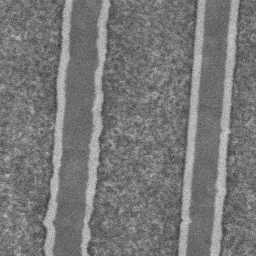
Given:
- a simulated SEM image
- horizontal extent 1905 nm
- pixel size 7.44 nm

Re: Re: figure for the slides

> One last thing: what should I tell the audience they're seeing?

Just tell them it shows one or a few lines or trenches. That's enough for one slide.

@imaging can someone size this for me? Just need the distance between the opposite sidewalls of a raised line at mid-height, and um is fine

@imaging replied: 0.26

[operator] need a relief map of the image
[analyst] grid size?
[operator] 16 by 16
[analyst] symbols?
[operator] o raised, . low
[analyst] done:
....ooo......oo.
....oo.......oo.
....oo......oo..
....oo......oo..
....oo......oo..
....oo......oo..
....oo......oo..
....oo......oo..
....oo......oo..
....oo......oo..
....oo......oo..
...ooo......oo..
...ooo......oo..
...oo.......oo..
...oo......ooo..
...oo......oo...